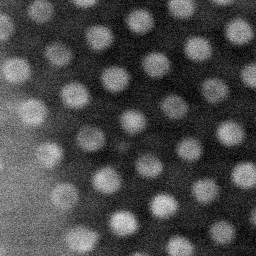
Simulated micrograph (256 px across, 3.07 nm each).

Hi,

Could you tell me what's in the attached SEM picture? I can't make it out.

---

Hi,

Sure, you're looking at a regular array of raised bodies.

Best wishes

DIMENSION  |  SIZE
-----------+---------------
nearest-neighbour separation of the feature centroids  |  134 nanometres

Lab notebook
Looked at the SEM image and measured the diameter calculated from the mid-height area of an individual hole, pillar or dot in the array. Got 74.9 nm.